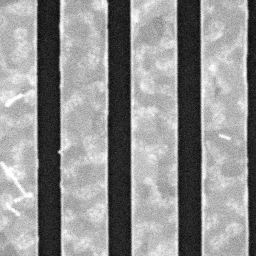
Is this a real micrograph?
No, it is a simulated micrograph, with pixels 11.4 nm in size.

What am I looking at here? one or a few lines or trenches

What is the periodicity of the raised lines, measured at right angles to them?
0.799 µm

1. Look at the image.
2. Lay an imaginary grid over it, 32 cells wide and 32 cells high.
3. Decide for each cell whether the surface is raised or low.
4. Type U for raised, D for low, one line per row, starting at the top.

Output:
UUUUUDDDUUUUUDDDUUUUUUDDDUUUUUUD
UUUUUDDDUUUUUDDDDUUUUUDDDUUUUUUD
UUUUUDDDUUUUUDDDDUUUUUDDDUUUUUUD
UUUUUDDDUUUUUDDDDUUUUUDDDUUUUUUD
UUUUUDDDUUUUUDDDDUUUUUDDDUUUUUUD
UUUUDDDDUUUUUDDDDUUUUUDDDUUUUUUD
UUUUDDDDUUUUUDDDDUUUUUDDDUUUUUUD
UUUUDDDDUUUUUDDDDUUUUUDDDUUUUUUD
UUUUDDDDUUUUUDDDDUUUUUDDDUUUUUUD
UUUUDDDDUUUUUDDDDUUUUUDDDUUUUUUD
UUUUDDDDUUUUUDDDDUUUUUDDDUUUUUUD
UUUUDDDDUUUUUDDDDUUUUUDDDUUUUUUD
UUUUDDDDUUUUUDDDDUUUUUDDDUUUUUUD
UUUUDDDDUUUUUDDDDUUUUUDDDUUUUUUD
UUUUDDDDUUUUUDDDDUUUUUDDDUUUUUUD
UUUUDDDDUUUUUDDDDUUUUUDDDUUUUUUD
UUUUDDDDUUUUUDDDDUUUUUDDDUUUUUUD
UUUUDDDDUUUUUDDDDUUUUUDDDUUUUUUD
UUUUUDDDUUUUUDDDDUUUUUDDDUUUUUUD
UUUUUDDDUUUUUDDDDUUUUUDDDUUUUUUD
UUUUUDDDUUUUUDDDDUUUUUDDDUUUUUUD
UUUUUDDDUUUUUDDDDUUUUUDDDUUUUUUD
UUUUDDDDUUUUUDDDDUUUUUDDDUUUUUUD
UUUUDDDDUUUUUDDDDUUUUUDDDUUUUUUD
UUUUDDDDUUUUUDDDDUUUUUDDDUUUUUUD
UUUUUDDDUUUUUDDDDUUUUUDDDUUUUUUD
UUUUUDDDUUUUUDDDDUUUUUDDDUUUUUUD
UUUUUDDDUUUUUDDDDUUUUUDDDUUUUUUD
UUUUUDDDUUUUUDDDDUUUUUDDDUUUUUUD
UUUUUDDDUUUUUDDDDUUUUUDDDUUUUUUD
UUUUUDDDUUUUUDDDDUUUUUDDDUUUUUUD
UUUUUDDDUUUUUDDDDUUUUUDDDUUUUUUD